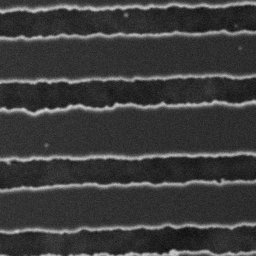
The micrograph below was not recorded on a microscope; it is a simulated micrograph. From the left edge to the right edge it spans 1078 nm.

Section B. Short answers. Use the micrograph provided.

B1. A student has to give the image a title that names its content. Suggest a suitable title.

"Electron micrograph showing lines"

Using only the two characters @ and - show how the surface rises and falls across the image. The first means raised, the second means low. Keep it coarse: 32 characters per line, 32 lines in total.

@@@@@@@@@@@@@@@@@@@@@@@@@@@@@@@@
@---@---------------------------
--------------------------------
--------------------------------
-------@@@-@@@@@@@@@@@@@@@@@@@@@
@@@@@@@@@@@@@@@@@@@@@@@@@@@@@@@@
@@@@@@@@@@@@@@@@@@@@@@@@@@@@@@@@
@@@@@@@@@@@@@@@@@@@@@@@@@@@@@@@@
@@@@@@@@@@@@@@@@@@@@@@@@@@@@@@@@
@@@@@@@@@@@@@@@@@@@@@@@@@@@@@@@@
--------------------------------
--------------------------------
--------------------------------
--------@@@--@@@@@@@@@@@@@@@@@@@
@@@@@@@@@@@@@@@@@@@@@@@@@@@@@@@@
@@@@@@@@@@@@@@@@@@@@@@@@@@@@@@@@
@@@@@@@@@@@@@@@@@@@@@@@@@@@@@@@@
@@@@@@@@@@@@@@@@@@@@@@@@@@@@@@@@
@@@@@@@@@@@@@@@@@@@@@@@@@@@@@@@@
@@@@@@@@@@@@@@@@@@@@@--@@-@-----
--------------------------------
--------------------------------
--------------------------------
--@@-@@@@@@@@@@@@@@@@@@@@@@@@@@@
@@@@@@@@@@@@@@@@@@@@@@@@@@@@@@@@
@@@@@@@@@@@@@@@@@@@@@@@@@@@@@@@@
@@@@@@@@@@@@@@@@@@@@@@@@@@@@@@@@
@@@@@@@@@@@@@@@@@@@@@@@@@@@@@@@@
@@@@@@@@@@@@@@@@@-@@------------
--------------------------------
--------------------------------
---------------------@@@@@-----@